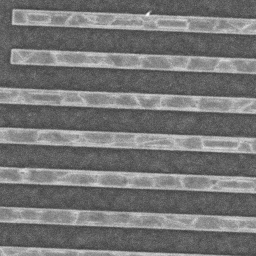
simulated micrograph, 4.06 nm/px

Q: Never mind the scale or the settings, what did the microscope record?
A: parallel lines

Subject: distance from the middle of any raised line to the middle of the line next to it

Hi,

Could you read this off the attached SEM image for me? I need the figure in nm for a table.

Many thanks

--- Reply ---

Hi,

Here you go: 161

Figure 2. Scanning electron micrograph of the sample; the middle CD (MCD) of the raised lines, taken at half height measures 14 px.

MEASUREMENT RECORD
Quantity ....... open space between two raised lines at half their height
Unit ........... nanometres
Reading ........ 106